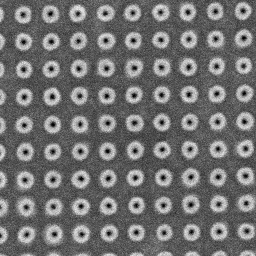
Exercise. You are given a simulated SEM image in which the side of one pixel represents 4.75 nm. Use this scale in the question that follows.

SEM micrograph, a regular array of ring-shaped raised bodies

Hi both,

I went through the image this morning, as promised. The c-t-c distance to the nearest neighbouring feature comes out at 0.129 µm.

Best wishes